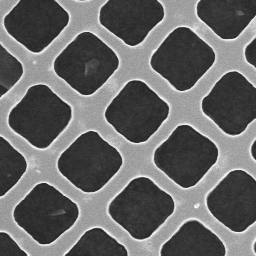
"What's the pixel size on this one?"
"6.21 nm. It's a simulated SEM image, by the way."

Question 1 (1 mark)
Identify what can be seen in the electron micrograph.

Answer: a regular array of holes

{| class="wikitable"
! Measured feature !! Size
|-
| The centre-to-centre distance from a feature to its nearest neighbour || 420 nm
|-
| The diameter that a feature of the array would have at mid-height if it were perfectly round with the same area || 360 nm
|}